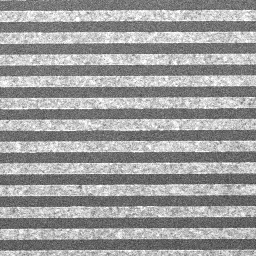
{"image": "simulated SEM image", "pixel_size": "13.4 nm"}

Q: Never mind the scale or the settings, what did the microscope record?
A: parallel lines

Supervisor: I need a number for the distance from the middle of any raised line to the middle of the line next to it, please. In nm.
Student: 291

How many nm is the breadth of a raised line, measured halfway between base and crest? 135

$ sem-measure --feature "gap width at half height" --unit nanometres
155